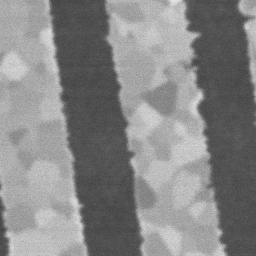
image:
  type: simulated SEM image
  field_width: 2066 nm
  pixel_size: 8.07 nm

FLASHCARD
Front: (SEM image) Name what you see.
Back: one or a few lines or trenches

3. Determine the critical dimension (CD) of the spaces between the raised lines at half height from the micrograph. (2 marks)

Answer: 473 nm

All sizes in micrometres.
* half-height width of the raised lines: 0.606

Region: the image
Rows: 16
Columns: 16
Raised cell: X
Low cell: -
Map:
XXX----XXXXX---X
XXX----XXXXX----
XXX----XXXXX----
XXX----XXXXX----
XXXX---XXXXX----
XXXX----XXXX----
XXXXX---XXXX----
XXXX----XXXXX---
XXXX----XXXXX---
XXXX----XXXXX---
XXXXX---XXXXX---
XXXXX---XXXXX---
XXXXX----XXXX---
XXXXX----XXXXX--
XXXXX---XXXXXX--
-XXXX----XXXXX--